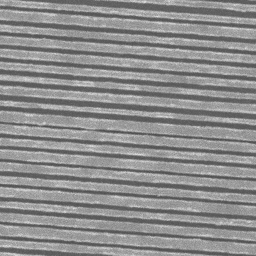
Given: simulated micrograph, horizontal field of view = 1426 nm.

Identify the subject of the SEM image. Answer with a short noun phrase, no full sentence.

parallel lines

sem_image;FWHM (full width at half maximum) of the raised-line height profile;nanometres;42.3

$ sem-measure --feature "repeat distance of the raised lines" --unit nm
70.3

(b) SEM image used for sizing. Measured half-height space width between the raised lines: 28.4 nm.